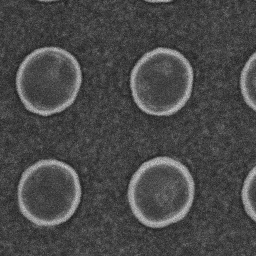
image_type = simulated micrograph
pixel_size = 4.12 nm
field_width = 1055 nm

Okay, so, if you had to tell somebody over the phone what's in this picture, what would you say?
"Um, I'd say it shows raised bodies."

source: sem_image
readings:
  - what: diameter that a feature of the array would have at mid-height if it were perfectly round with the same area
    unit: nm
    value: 259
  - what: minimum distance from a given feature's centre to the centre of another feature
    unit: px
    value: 111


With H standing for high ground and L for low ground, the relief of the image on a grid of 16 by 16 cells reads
LLLLLLLLLLLLLLLL
LLLLLLLLLLLLLLLL
LLLLLLLLLLLLLLLL
LLHHLLLLLHHLLLLL
LHHHHLLLHHHHLLLH
LHHHHLLLHHHHLLLH
LLHHLLLLLHHLLLLL
LLLLLLLLLLLLLLLL
LLLLLLLLLLLLLLLL
LLLLLLLLLLLLLLLL
LLHHLLLLLHHLLLLL
LHHHHLLLHHHHLLLH
LHHHHLLLHHHHLLLH
LLHHLLLLLHHLLLLL
LLLLLLLLLLLLLLLL
LLLLLLLLLLLLLLLL